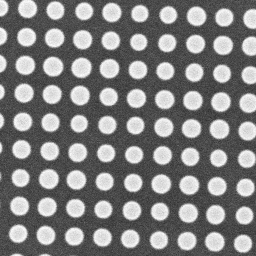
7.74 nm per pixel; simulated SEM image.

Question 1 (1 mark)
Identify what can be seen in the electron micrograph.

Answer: an array of small figures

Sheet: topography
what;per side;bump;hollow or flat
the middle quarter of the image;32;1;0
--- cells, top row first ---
00111110011111001111000011100001
00111110011111001111100111100001
00111100011110000111000111100001
00000000000000000010000011100001
00000000000000000000000000000000
00000000000000000000000000000000
00111100001100000100000000000000
00111100011110001111000111100001
00111100011110001111000111100011
00111100011110001111000111100011
00000000000000000110000011100011
00000000000000000000000000000000
00000000000000000000000000000000
00111000001100000110000000000000
00111100011110001111000111100011
00111100011110001111000111100011
00111000011110001111000111100011
00000000000000000000000111000011
00000000000000000000000000000000
00000000000000000000000000000000
00111000001100000000000000000000
01111100011100001110000111000011
01111100111110001111000111100011
00111000011100001111000111100111
00000000000000000110000111000011
00000000000000000000000000000000
00000000000000000000000000000000
01111000011000000000000000000000
01111000111100001110000111000011
01111000111100011110001111100111
01111000111100011110001111100111
00000000000000001110001111000111